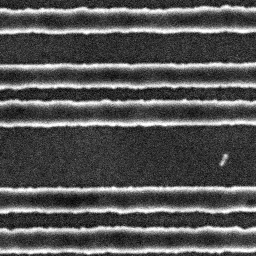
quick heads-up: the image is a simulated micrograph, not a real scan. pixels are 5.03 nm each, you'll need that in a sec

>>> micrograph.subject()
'lines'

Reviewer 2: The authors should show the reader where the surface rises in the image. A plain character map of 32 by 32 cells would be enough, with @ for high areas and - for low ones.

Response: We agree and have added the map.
--------------------------------
@@@@@@@@@@@@@@@@@@@@@@@@@@@@@@@@
@@@@@@@@@@@@@@@@@@@@@@@@@@@@@@@@
@@@@@@@@@@@@@@@@@@@@@@@@@@@@@@@@
--------------------------------
--------------------------------
--------------------------------
--------------------------------
@@@@@@@@@@@@@@@@@@@@@@@@@@@@@@@@
@@@@@@@@@@@@@@@@@@@@@@@@@@@@@@@@
@@@@@@@@@@@@@@@@@@@@@@@@@@@@@@@@
--------------------------------
--------------------------------
@@@@@@@@@@@@@@@@@@@@@@@@@@@@@@@@
@@@@@@@@@@@@@@@@@@@@@@@@@@@@@@@@
@@@@@@@@@@@@@@@@@@@@@@@@@@@@@--@
--------------------------------
--------------------------------
--------------------------------
--------------------------------
--------------------------------
--------------------------------
--------------------------------
-------@----@@@@@@@@@@@@@@@@-@@@
@@@@@@@@@@@@@@@@@@@@@@@@@@@@@@@@
@@@@@@@@@@@@@@@@@@@@@@@@@@@@@@@@
@----@@--@-----@--@-------@@----
--------------------------------
------------@@@@---------@@--@--
@@@@@@@@@@@@@@@@@@@@@@@@@@@@@@@@
@@@@@@@@@@@@@@@@@@@@@@@@@@@@@@@@
@@@@@@@@-@@@@-@@@@@-@@@---@@----